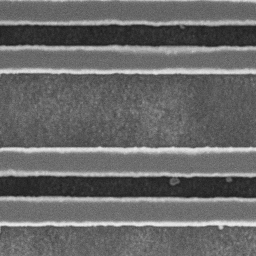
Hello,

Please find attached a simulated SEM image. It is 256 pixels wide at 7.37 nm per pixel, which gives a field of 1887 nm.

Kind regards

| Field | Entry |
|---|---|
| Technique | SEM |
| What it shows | lines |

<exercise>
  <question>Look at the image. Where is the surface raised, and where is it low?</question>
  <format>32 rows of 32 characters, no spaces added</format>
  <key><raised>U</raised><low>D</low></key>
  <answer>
UUUUUUUUUUUUUUUUUUUUUUUUUUUUUUUU
UUUUUUUUUUUUUUUUUUUUUUUUUUUUUUUU
UUUUUUUUUUUUUUUUUUUUUUUUUUUUUUUU
DDDDDDDDDDDDDDDDDDDDDDDDDDDDDDDD
DDDDDDDDDDDDDDDDDDDDDDDDDDDDDDDD
DDDDDDDDDDDDDDDDDDDDDDDDDDDDDDDD
UUUUUUUUUUUUUUUUUUUUUUUUUUUUUUUU
UUUUUUUUUUUUUUUUUUUUUUUUUUUUUUUU
UUUUUUUUUUUUUUUUUUUUUUUUUUUUUUUU
DDDDDDDDDDDDDDDDDDDDDDDDDDDDDDDD
DDDDDDDDDDDDDDDDDDDDDDDDDDDDDDDD
DDDDDDDDDDDDDDDDDDDDDDDDDDDDDDDD
DDDDDDDDDDDDDDDDDDDDDDDDDDDDDDDD
DDDDDDDDDDDDDDDDDDDDDDDDDDDDDDDD
DDDDDDDDDDDDDDDDDDDDDDDDDDDDDDDD
DDDDDDDDDDDDDDDDDDDDDDDDDDDDDDDD
DDDDDDDDDDDDDDDDDDDDDDDDDDDDDDDD
DDDDDDDDDDDDDDDDDDDDDDDDDDDDDDDD
DDDDDDDDDDDDDDDDDDDDDDDDDDDDDDDD
UUUUUUUUUUUUUUUUUUUUUUUUUUUUUUUU
UUUUUUUUUUUUUUUUUUUUUUUUUUUUUUUU
UUUUUUUUUUUUUUUUUUUUUUUUUUUUUUUU
DDDDDDDDDDDDDDDDDDDDDDDDDDDDDDDD
DDDDDDDDDDDDDDDDDDDDDDDDDDDDDDDD
DDDDDDDDDDDDDDDDDDDDDDDDDDDDDDDD
UUUUUUUUUUUUUUUUUUUUUUUUUUUUUUUU
UUUUUUUUUUUUUUUUUUUUUUUUUUUUUUUU
UUUUUUUUUUUUUUUUUUUUUUUUUUUUUUUU
DDDDDDDDDDDDDDDDDDDDDDDDDDDDDDDD
DDDDDDDDDDDDDDDDDDDDDDDDDDDDDDDD
DDDDDDDDDDDDDDDDDDDDDDDDDDDDDDDD
DDDDDDDDDDDDDDDDDDDDDDDDDDDDDDDD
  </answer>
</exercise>